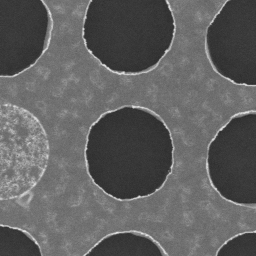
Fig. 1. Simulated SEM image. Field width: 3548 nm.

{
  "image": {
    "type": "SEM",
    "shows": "holes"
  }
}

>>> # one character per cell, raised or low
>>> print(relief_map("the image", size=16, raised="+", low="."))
...+++.....+++..
...++......++...
...++......++...
..++++....+++...
.++++++..+++++..
++++++++++++++++
++++++++++++++++
++++++....+++++.
++++++.....+++..
+++++......++...
++++++.....++...
++++++....+++...
++++++++++++++..
++++++++++++++++
.+++++++++++++++
..++++....++++..